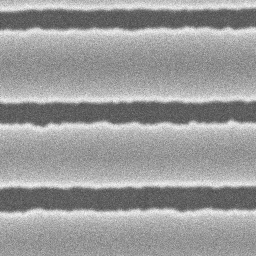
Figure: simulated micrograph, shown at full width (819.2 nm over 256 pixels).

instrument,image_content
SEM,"lines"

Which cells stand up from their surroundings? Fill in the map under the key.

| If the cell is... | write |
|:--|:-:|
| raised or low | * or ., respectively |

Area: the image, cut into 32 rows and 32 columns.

********************************
................................
................................
.......................*.*..*..*
********************************
********************************
********************************
********************************
********************************
********************************
********************************
********************************
********************************
................................
................................
........**..**..*...*...***.****
********************************
********************************
********************************
********************************
********************************
********************************
********************************
................................
................................
................................
....********.*********.*********
********************************
********************************
********************************
********************************
********************************